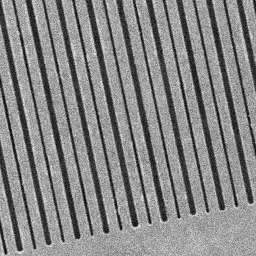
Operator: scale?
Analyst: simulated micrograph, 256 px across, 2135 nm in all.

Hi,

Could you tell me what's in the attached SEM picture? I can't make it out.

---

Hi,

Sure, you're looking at parallel lines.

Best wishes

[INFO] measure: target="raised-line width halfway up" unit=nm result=78.5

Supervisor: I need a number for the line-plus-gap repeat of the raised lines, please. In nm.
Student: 123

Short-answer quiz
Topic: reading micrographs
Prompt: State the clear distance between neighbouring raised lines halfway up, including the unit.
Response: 0.0561 microns